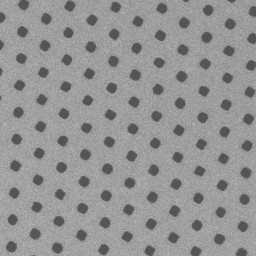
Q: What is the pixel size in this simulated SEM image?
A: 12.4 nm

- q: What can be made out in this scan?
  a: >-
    a regular array of holes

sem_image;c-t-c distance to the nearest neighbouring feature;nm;325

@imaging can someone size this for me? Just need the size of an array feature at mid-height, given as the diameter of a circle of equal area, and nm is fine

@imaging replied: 131